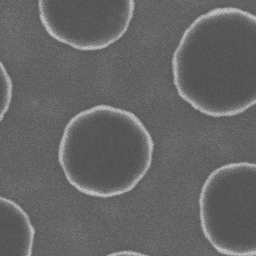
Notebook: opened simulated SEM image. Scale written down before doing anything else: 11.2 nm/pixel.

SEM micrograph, raised bodies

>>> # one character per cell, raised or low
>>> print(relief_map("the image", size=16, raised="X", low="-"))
---XXXXX--------
---XXXXX----XXXX
----XXX----XXXXX
-----------XXXXX
-----------XXXXX
X----------XXXXX
------------XXXX
-----XXX--------
----XXXXX-------
----XXXXX-------
----XXXXX-----XX
-----XXX-----XXX
-------------XXX
XX-----------XXX
XX-----------XXX
XX------------XX